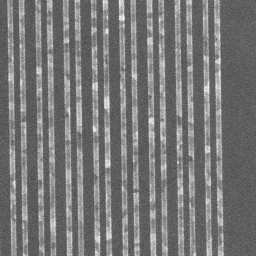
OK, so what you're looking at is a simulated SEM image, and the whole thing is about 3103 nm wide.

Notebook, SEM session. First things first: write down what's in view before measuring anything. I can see parallel lines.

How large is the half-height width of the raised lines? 0.0621 um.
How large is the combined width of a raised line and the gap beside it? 167 nm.